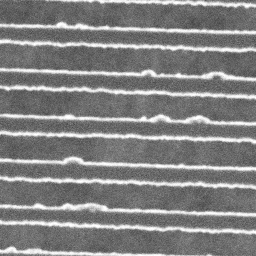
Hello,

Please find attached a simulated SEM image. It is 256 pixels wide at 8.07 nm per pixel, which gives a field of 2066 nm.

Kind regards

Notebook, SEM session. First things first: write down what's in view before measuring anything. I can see lines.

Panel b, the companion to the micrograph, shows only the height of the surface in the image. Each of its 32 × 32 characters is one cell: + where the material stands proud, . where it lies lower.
........................++++++++
................................
................................
++++++++++++++..................
++++++++++++++++++++++++++++++++
..++++++++++++++++++++++++++++++
................................
................................
................................
++++++++++++++++++++++++..++....
++++++++++++++++++++++++++++++++
.............+++++++++++++++++++
................................
................................
++..............................
++++++++++++++++++++++++++++++++
++++++++++++++++++++++++++++++++
............................++++
................................
................................
++++++++++++++++................
++++++++++++++++++++++++++++++++
.+.+++++++++++++++++++++++++++++
................................
................................
................................
+++++++++++++++++++++...........
++++++++++++++++++++++++++++++++
..............+..+++++++++++++++
................................
................................
+++++...........................